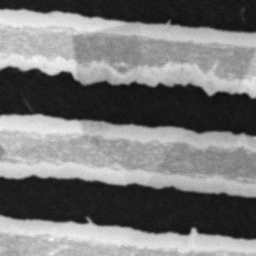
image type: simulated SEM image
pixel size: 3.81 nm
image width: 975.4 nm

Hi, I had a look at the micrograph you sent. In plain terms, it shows one or a few lines or trenches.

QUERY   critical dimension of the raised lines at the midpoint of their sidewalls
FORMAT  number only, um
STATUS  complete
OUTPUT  0.171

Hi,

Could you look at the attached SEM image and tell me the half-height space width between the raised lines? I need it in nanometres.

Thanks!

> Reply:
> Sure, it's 227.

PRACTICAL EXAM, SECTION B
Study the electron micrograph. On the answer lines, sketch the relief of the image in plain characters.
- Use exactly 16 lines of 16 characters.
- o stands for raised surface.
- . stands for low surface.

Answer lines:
................
ooooo...........
oooooooooooooooo
oooooooooooooooo
.....o.ooooooooo
................
................
................
ooooooooooo.....
oooooooooooooooo
oooooooooooooooo
.............ooo
................
................
oooooo..........
oooooooooooooooo